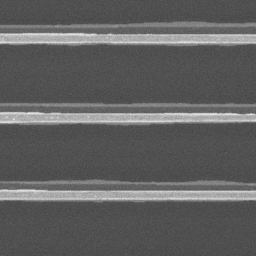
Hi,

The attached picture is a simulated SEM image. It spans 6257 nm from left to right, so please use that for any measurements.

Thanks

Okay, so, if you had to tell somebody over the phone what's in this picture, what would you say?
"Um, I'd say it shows lines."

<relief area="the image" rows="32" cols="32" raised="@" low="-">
--------------------------------
--------------------------------
--------------------------------
@@@@@@@@@@@@@@@@@@@@@@@@@@@@@@@@
@@@@@@@@@@@@@@@@@@@@@@@@@@@@@@@@
--------------------------------
--------------------------------
--------------------------------
--------------------------------
--------------------------------
--------------------------------
--------------------------------
--------------------------------
@@@@@@@@@@@@@@@@@@@@@@@@@@@@@@@@
@@@@@@@@@@@@@@@@@@@@@@@@@@@@@@@@
--------------------------------
--------------------------------
--------------------------------
--------------------------------
--------------------------------
--------------------------------
--------------------------------
--------------------------------
@@@@@@@@@@@@@@@@@@@@@@@@@@@@@@@@
@@@@@@@@@@@@@@@@@@@@@@@@@@@@@@@@
--------------------------------
--------------------------------
--------------------------------
--------------------------------
--------------------------------
--------------------------------
--------------------------------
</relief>